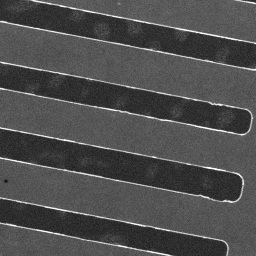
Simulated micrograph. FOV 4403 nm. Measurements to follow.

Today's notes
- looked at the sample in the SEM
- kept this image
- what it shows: one or a few lines or trenches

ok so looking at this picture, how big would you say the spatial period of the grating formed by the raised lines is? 1140 nanometers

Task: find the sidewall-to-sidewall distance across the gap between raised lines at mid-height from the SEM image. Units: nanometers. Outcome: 672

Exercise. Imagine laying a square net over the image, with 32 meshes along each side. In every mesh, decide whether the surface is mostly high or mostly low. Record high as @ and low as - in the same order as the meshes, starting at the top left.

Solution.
@@@@@@@-------------------------
@@@@@@@@@@@@--------------------
@@@@@@@@@@@@@@@@@---------------
----@@@@@@@@@@@@@@@@@@----------
---------@@@@@@@@@@@@@@@@@@-----
---------------@@@@@@@@@@@@@@@@@
--------------------@@@@@@@@@@@@
-------------------------@@@@@@@
@@@@--------------------------@@
@@@@@@@@@-----------------------
@@@@@@@@@@@@@@@-----------------
--@@@@@@@@@@@@@@@@@@------------
-------@@@@@@@@@@@@@@@@@@-------
-------------@@@@@@@@@@@@@@@@@--
------------------@@@@@@@@@@@@@-
-----------------------@@@@@@@@-
@@@-------------------------@@@-
@@@@@@@@------------------------
@@@@@@@@@@@@@-------------------
@@@@@@@@@@@@@@@@@@--------------
----@@@@@@@@@@@@@@@@@@@@--------
---------@@@@@@@@@@@@@@@@@@@@---
--------------@@@@@@@@@@@@@@@@--
-------------------@@@@@@@@@@@--
-------------------------@@@@@--
@@@@----------------------------
@@@@@@@@@@----------------------
@@@@@@@@@@@@@@@-----------------
---@@@@@@@@@@@@@@@@@------------
--------@@@@@@@@@@@@@@@@@-------
--------------@@@@@@@@@@@@@@----
-------------------@@@@@@@@@----